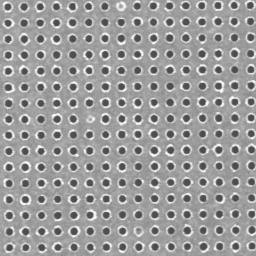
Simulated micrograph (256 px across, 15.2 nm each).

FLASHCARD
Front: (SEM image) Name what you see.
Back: a regular array of holes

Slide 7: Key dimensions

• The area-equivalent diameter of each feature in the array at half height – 114 nm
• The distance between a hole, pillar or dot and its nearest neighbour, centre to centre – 240 nanometers